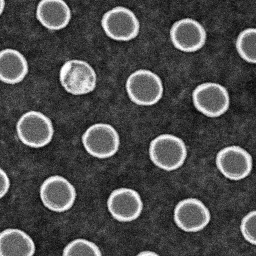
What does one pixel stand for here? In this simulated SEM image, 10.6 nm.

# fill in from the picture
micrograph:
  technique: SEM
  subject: a regular array of raised bodies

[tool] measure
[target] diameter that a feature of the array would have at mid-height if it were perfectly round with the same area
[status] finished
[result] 346 nm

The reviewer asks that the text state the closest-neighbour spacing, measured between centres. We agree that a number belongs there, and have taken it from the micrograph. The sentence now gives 712 nm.